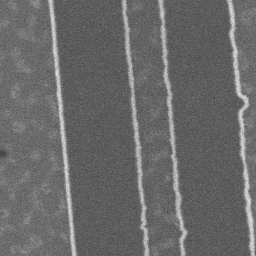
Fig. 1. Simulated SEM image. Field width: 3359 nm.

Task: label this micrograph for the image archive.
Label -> one or a few lines or trenches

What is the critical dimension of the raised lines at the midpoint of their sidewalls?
951 nm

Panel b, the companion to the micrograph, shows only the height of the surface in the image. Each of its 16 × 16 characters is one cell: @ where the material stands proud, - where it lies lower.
---@@@@@--@@@@--
---@@@@@--@@@@@-
---@@@@@--@@@@@-
---@@@@@--@@@@@-
----@@@@--@@@@@-
----@@@@---@@@@-
----@@@@---@@@@-
----@@@@---@@@@-
----@@@@@--@@@@-
----@@@@@--@@@@-
----@@@@@--@@@@-
----@@@@@--@@@@-
----@@@@@--@@@@-
----@@@@@--@@@@@
----@@@@@--@@@@@
-----@@@@--@@@@@